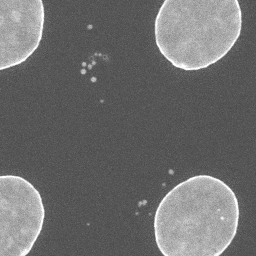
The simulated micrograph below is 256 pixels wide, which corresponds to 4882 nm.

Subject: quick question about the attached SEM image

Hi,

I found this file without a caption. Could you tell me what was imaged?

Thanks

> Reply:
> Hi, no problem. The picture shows raised bodies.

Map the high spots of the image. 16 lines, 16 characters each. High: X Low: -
XXX-------XXXXX-
XXX-------XXXXX-
XX--------XXXXX-
XX--------XXXX--
----------------
----------------
----------------
----------------
----------------
----------------
----------------
XX---------XXX--
XXX-------XXXXX-
XXX-------XXXXX-
XX--------XXXXX-
XX--------XXXX--